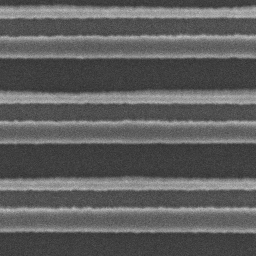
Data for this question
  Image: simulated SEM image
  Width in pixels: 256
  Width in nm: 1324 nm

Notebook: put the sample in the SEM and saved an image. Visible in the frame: lines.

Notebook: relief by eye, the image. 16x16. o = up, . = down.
................
oooooooooooooooo
oooooooooooooooo
oooooooooooooooo
................
................
oooooooooooooooo
oooooooooooooooo
oooooooooooooooo
................
................
oooooooooooooooo
oooooooooooooooo
oooooooooooooooo
................
................